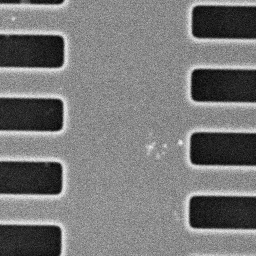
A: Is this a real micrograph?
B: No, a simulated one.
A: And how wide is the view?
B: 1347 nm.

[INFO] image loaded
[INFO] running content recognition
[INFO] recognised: groups of lines, slits or small figures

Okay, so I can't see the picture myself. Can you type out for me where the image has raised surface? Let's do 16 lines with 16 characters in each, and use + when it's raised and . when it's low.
++++++++++++....
++++++++++++....
....++++++++++++
....++++++++++++
++++++++++++....
++++++++++++....
....++++++++++++
....++++++++++++
++++++++++++....
++++++++++++....
....++++++++++++
....++++++++++++
++++++++++++....
++++++++++++....
....++++++++++++
....++++++++++++